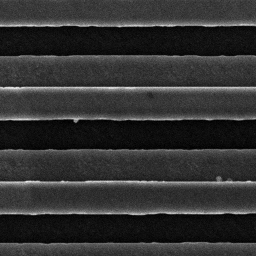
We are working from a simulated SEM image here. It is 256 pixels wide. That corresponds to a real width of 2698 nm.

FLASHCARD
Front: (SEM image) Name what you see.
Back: lines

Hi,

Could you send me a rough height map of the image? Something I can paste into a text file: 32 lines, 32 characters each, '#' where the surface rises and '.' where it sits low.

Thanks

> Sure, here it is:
################################
################################
################################
................................
................................
................................
................................
################################
################################
################################
################################
################################
################################
################################
################################
................................
................................
................................
................................
################################
################################
################################
################################
################################
################################
################################
################################
................................
................................
................................
################################
################################